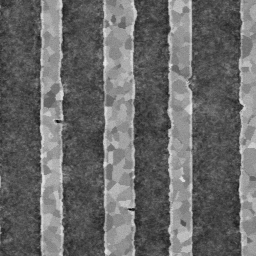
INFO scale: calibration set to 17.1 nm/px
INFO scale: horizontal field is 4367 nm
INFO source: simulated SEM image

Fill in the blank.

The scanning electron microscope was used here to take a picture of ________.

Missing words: one or a few lines or trenches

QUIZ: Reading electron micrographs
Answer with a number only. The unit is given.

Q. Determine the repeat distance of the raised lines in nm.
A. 1100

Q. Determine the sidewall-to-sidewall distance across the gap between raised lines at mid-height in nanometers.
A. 749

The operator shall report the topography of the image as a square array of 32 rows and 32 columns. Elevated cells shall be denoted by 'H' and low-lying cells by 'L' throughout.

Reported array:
LLLLLHHHLLLLLHHHHLLLLHHHLLLLLLHH
LLLLLHHHLLLLLHHHHLLLLHHHLLLLLLHH
LLLLLHHHLLLLLHHHHLLLLHHHLLLLLLHH
LLLLLHHHLLLLLHHHHLLLLHHHLLLLLLHH
LLLLLHHHLLLLLHHHLLLLLHHHLLLLLLHH
LLLLLHHHLLLLLHHHHLLLLHHHLLLLLLHH
LLLLLHHHLLLLLHHHLLLLLHHHLLLLLLHH
LLLLLHHHLLLLLHHHLLLLLHHHLLLLLLHH
LLLLLHHLLLLLLHHHHLLLLHHHLLLLLLHH
LLLLLHHLLLLLLHHHHLLLLHHHLLLLLLHH
LLLLLHHHLLLLLHHHHLLLLHHLLLLLLLHH
LLLLLHHHLLLLLHHHHLLLLHHHLLLLLLHH
LLLLLHHHLLLLLHHHHLLLLHHHLLLLLLHH
LLLLLHHHLLLLLHHHHLLLLHHHLLLLLLHH
LLLLLHHHLLLLLHHHHLLLLHHHLLLLLLHH
LLLLLHHLLLLLLHHHLLLLLLHHLLLLLLHH
LLLLLHHHLLLLLHHHHLLLLHHHLLLLLLHH
LLLLLHHHLLLLLHHHHLLLLHHHLLLLLLHH
LLLLLHHHLLLLLHHHHLLLLHHHLLLLLLHH
LLLLLHHHLLLLLHHHHLLLLHHHLLLLLLHH
LLLLLHHHLLLLLHHHHLLLLHHHLLLLLLHH
LLLLLHHHLLLLLHHHHLLLLHHHLLLLLLHH
LLLLLHHHLLLLLHHHHLLLLHHHLLLLLLHH
LLLLLHHHLLLLLHHHHLLLLHHHLLLLLLHH
LLLLLHHHLLLLLHHHHLLLLHHHLLLLLLHH
LLLLLHHHLLLLLHHHHLLLLHHHLLLLLLHH
LLLLLHHHLLLLLHHHLLLLLHHHLLLLLLHH
LLLLLHHHLLLLLHHHHLLLLHHHLLLLLLHH
LLLLLHHHLLLLLHHHHLLLLHHHLLLLLLHH
LLLLLHHHLLLLLHHHHLLLLHHHLLLLLLHH
LLLLLHHHLLLLLHHHHLLLLHHHLLLLLLHH
LLLLLHHHLLLLLHHHHLLLLHHHLLLLLLHH